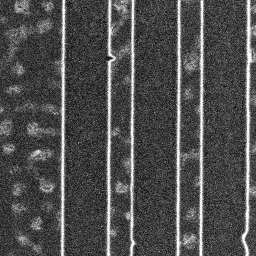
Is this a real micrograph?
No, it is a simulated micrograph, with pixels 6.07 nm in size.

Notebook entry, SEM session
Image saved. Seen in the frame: one or a few lines or trenches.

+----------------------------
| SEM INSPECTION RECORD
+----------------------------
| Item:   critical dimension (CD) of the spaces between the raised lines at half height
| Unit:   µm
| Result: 0.281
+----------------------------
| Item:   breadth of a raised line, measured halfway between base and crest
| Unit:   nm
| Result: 140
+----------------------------